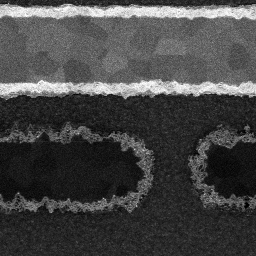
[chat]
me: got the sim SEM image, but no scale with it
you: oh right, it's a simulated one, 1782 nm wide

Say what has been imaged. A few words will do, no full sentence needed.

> one or a few lines or trenches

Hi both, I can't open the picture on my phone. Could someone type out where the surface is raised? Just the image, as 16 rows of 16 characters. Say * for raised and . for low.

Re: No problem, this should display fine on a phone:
................
****************
****************
****************
****************
*....****..****.
................
................
..****..........
*********....***
*********...****
*********....***
********......**
................
................
................